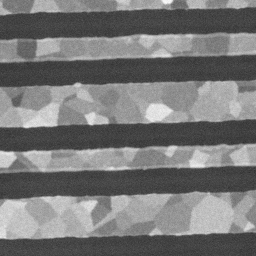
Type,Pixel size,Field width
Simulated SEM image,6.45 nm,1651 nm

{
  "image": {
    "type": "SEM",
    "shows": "lines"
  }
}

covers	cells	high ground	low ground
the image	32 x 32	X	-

XXXXXXXXXXXXXXXXXXXXXXXXXXXXXXXX
XXXXX---------------------------
--------------------------------
--------------------------------
----------------XXXXXXXXXXXXXXXX
XXXXXXXXXXXXXXXXXXXXXXXXXXXXXXXX
XXXXXXXXXXXXXXXXXXXXXXXXXXXXXXXX
XXXXXXXXX-----------------------
--------------------------------
--------------------------------
----------------XXXXXXXXXXXXXXXX
XXXXXXXXXXXXXXXXXXXXXXXXXXXXXXXX
XXXXXXXXXXXXXXXXXXXXXXXXXXXXXXXX
XXXXXXXXXXXXXXXXXXXXXXXXXXXXXXXX
XXXXXXXXXXXXXXXXXXXXXXXXXXXXXXXX
XXXXXXXXX--X--------------------
--------------------------------
--------------------------------
---------------XX-XXXXXXXXXXXXXX
XXXXXXXXXXXXXXXXXXXXXXXXXXXXXXXX
XXXXXXXXXXXXXXXXXXXXXXXXXXXXXXXX
XX------------------------------
--------------------------------
--------------------------------
---------------XXXXXXXXXXXXXXXXX
XXXXXXXXXXXXXXXXXXXXXXXXXXXXXXXX
XXXXXXXXXXXXXXXXXXXXXXXXXXXXXXXX
XXXXXXXXXXXXXXXXXXXXXXXXXXXXXXXX
XXXXXXXXXXXXXXXXXXXXXXXXXXXXXXXX
XXXXXXXXXXXXXXXX----------------
--------------------------------
--------------------------------